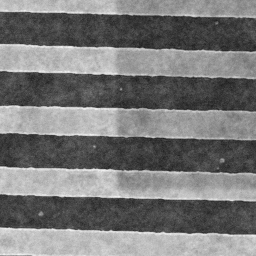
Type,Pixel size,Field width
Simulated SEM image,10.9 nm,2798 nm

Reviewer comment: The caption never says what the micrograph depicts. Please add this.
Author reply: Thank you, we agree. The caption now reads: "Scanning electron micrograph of lines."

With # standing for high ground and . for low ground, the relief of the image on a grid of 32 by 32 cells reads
################################
...#############################
................................
................................
................................
................................
################################
################################
################################
......................##########
................................
................................
................................
############....................
################################
################################
################################
................................
................................
................................
................................
#######################.#.......
################################
################################
.......#########################
................................
................................
................................
................................
################################
################################
################################